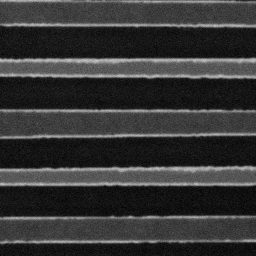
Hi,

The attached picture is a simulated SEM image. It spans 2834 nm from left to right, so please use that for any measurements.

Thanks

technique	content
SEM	lines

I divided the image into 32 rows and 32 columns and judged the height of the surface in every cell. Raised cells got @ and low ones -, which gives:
@@@@@@@@@@@@@@@@@@@@@@@@@@@@@@@@
@@@@@@@@@@@@@@@@@@@@@@@@@@@@@@@@
@@@@@@@@@@@@@@@@@@@@@@@@@@@@@@@@
--------------------------------
--------------------------------
--------------------------------
--------------------------------
@@-@-@@-@-@@--@@@@@@@@@@@@@@@@@@
@@@@@@@@@@@@@@@@@@@@@@@@@@@@@@@@
-----@@@@@@@@@@@@@@@@@@@@@@@@@@@
--------------------------------
--------------------------------
--------------------------------
--------------------------------
@@@@@@@@@@@@@@@@@@@@@@@@@@@@@@@@
@@@@@@@@@@@@@@@@@@@@@@@@@@@@@@@@
@@@@@@@@@@@@@@@@@@@@@@@@@@@@@@@@
--------------------------------
--------------------------------
--------------------------------
--------------------------------
@@@@@@@@@@@@@@@@@@@@@@@@@@@@@@@@
@@@@@@@@@@@@@@@@@@@@@@@@@@@@@@@@
--------------------------------
--------------------------------
--------------------------------
--------------------------------
@@@@@@@@@@@@@@@@@@@@@@@@@@@@@@@@
@@@@@@@@@@@@@@@@@@@@@@@@@@@@@@@@
@@@@@@@@@@@@@@@@@@@@@@@@@@@@@@@@
--------------------------------
--------------------------------